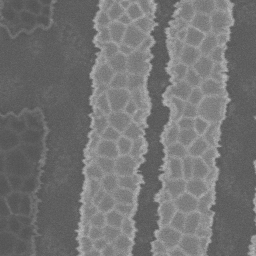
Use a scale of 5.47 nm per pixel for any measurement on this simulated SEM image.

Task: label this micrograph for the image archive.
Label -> one or a few lines or trenches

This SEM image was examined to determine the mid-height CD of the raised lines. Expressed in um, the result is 0.287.